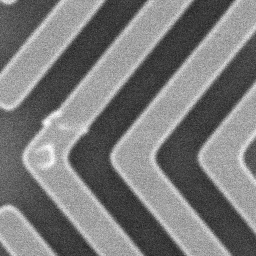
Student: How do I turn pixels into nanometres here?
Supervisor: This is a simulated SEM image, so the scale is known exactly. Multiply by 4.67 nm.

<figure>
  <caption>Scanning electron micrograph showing groups of lines, slits or small figures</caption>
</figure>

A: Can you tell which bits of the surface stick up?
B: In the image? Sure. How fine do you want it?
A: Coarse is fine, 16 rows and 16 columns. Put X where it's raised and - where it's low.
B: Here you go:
---XXX---XXX--XX
---XX---XXX---XX
--XX---XXX---XX-
-XXX--XXX---XXX-
XXX---XX---XXX--
XX---XX---XXX---
X---XXX--XXX---X
---XXX---XX---XX
--XXX---XX---XXX
--XX---XXX---XX-
--XX---XXX---XX-
---XX---XXX--XXX
---XXX---XXX--XX
X---XXX---XX---X
XX---XXX--XXX---
XXX---XXX--XXX--